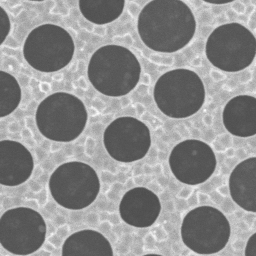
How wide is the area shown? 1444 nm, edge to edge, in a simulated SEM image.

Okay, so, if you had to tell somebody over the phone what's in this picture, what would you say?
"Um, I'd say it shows a regular array of holes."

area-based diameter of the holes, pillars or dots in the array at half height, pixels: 49.4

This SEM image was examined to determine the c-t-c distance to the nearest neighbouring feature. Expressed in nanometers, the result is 390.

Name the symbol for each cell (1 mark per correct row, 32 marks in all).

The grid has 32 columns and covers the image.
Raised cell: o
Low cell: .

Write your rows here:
oooooooooo......oo.....oooo.oooo
.ooooooooo.....ooo......oooooooo
.oooooooooo...ooo.......oooooooo
.ooo....ooooooooo.......ooo....o
.oo......oooooooo.......oo......
ooo......ooooooooo.....ooo......
ooo......ooo....oooo..oooo......
ooo......oo......ooooooooo......
oooo....ooo.......ooooooooo....o
..ooooooooo......ooo.....ooooooo
..ooooooooo......oo......ooooooo
...oooo.oooo....ooo.......oooooo
...oo.....ooooooooo.......ooo...
..ooo......ooooooooo.....ooo....
.ooo.......oooooooooo...oooo....
ooooo......ooo....oooooooooo....
ooooo.....ooo......oooooooooo...
ooooooo..oooo......oooo..ooooooo
...oooooooooo......ooo....oooooo
....oooooooooo....ooo......ooooo
....oooo...oooooooooo......ooo..
....ooo.....oooooooooo.....oo...
...ooo......oooooooooo....ooo...
oooooo......ooooo.ooooooooooo...
ooooooo.....ooo.....ooooooooo...
ooooooo....oooo.....oooooooooo..
o....oooooooooo.....oooo....ooo.
.....oooooooooo....oooo.....oooo
......ooooooooooooooooo......ooo
......ooo....oooooooooo......oo.
.....ooo......ooooooooo.....ooo.
o...oooo......oooooooooo...oooo.